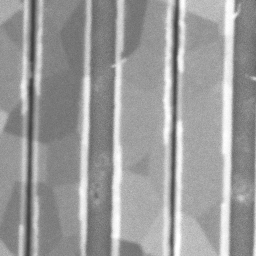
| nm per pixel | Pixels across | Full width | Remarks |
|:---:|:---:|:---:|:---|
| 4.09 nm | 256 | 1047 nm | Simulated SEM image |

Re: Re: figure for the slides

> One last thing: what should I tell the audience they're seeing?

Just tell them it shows one or a few lines or trenches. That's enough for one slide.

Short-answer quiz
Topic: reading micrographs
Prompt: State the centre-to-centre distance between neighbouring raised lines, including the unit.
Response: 291 nm